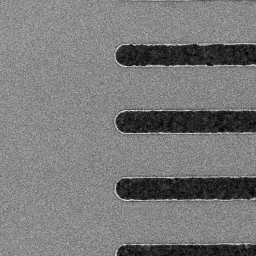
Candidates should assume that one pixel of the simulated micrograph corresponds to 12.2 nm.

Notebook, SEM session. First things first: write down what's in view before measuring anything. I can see one or a few lines or trenches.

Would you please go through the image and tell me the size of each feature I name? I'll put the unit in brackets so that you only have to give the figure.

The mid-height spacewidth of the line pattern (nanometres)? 527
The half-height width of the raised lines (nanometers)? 286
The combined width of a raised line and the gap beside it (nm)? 811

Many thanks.